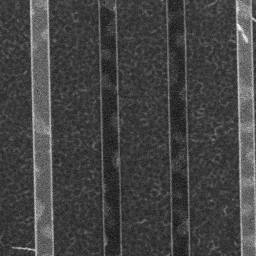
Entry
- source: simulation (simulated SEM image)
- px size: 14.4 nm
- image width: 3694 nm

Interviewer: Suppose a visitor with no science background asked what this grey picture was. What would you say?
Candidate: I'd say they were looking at one or a few lines or trenches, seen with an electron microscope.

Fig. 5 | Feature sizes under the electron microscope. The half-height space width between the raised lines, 0.734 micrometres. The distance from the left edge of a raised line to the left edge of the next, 984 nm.